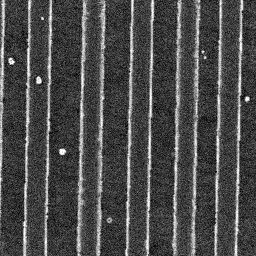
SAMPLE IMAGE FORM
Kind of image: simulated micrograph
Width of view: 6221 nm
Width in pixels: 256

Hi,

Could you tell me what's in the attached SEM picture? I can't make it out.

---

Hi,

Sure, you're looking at lines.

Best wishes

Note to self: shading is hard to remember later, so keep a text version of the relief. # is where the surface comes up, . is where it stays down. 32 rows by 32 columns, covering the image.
....##.....##....##...###...##..
....##.....##....##...###...##..
....##.....##....##...###...##..
....##....###...###...###...##..
....##....###...###...###...##..
....##....###...###...###..###..
....##....###...###...###..###..
....##....###...###...###..###..
....##....###...###...###..###..
....##....###...###...###..###..
....##....###...###...##...###..
....##....###...###...##...###..
...###....###...###...##...###..
...###....###...###...##...###..
...###....###...###...##...###..
...###....###...###...##...###..
...###....###...###...##...###..
...###....###...###...##...###..
...###....###...###...##...###..
...###....###...###...##...###..
...###....##....###...##...###..
...###....##....###...##...###..
...###....##....###...##...###..
...###....##....###...##...###..
...###....##....###...##...###..
...###....##....##....##...###..
...###....##....##....##...###..
...###....##....##....##...###..
...###....##....##....##...###..
...###....##....##....##...###..
...###....##....##....##...###..
...###....##....##....##...###..